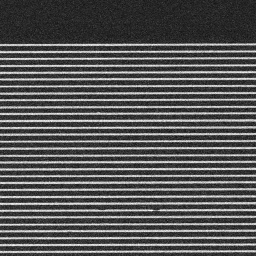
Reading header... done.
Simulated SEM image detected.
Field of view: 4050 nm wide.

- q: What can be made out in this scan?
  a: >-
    parallel lines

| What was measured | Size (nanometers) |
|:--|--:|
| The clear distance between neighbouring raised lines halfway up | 85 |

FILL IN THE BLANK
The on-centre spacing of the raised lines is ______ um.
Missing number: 0.109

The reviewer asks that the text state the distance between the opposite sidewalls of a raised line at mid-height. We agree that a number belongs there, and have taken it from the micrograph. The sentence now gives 25.7 nanometers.